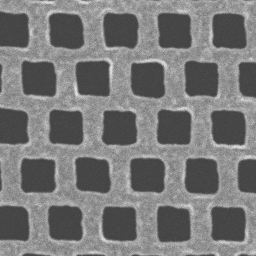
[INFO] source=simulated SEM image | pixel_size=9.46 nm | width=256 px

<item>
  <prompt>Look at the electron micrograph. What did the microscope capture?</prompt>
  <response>a regular array of holes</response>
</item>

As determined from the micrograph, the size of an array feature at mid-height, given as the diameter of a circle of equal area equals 359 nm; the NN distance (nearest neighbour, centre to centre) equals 512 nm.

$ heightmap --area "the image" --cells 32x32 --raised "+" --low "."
++++++++++++++++++++++++++++++++
++++++++++++++++++++++++++++++++
....++....+++....+++....+++....+
....++....+++....+++....+++....+
....++....+++....+++....+++....+
...+++....+++....+++....+++....+
++++++++++++++++++++++++++++++++
++++++++++++++++++++++++++++++++
+++....++.....++....+++....+++..
+++....+++....++.....++....+++..
+++....+++....++.....++....+++..
+++....+++....+++....++....+++..
++++++++++++++++++++++++++++++++
++++++++++++++++++++++++++++++++
....++....+++....+++....++.....+
....++....+++....+++....+++....+
...+++....+++....+++....+++....+
....++....+++....+++....+++....+
++++++++++++++++++++++++++++++++
++++++++++++++++++++++++++++++++
+++....++.....++.....++....+++..
+++....++.....++.....++....+++..
+++....+++....++.....++....+++..
+++....+++....++....+++....+++..
++++++++++++++++++++++++++++++++
++++++++++++++++++++++++++++++++
...+++....+++....+++....++.....+
....++....+++....+++....++.....+
....++....+++....+++....++.....+
....++....+++....+++....++.....+
++++++++++++++++++++++++++++++++
++++++++++++++++++++++++++++++++